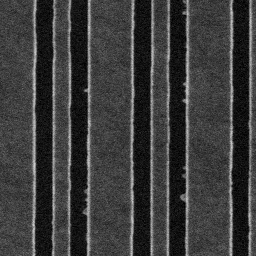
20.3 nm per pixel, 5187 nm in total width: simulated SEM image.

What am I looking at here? lines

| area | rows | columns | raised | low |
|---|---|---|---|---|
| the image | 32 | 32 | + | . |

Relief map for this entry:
++++...++..++++++..++..++++++..+
++++...++..++++++..++..++++++..+
++++...++..++++++..++..++++++..+
++++...++..++++++..++..++++++..+
++++...++..++++++..++..++++++..+
++++...++..++++++..++..++++++..+
++++...++..++++++..++..++++++..+
++++...++..++++++..++..++++++..+
++++...++..++++++..++..++++++..+
++++...++..++++++..++..++++++..+
++++...++..++++++..++..++++++..+
++++...++..++++++..++..++++++..+
++++...++..++++++..++..++++++..+
++++...++..++++++..++..++++++..+
++++...++..++++++..++..++++++..+
++++...++..++++++..++..++++++..+
++++...++..++++++..++..++++++..+
++++...++..++++++..++..++++++..+
++++...++..++++++..++..++++++..+
++++...++..++++++..++..++++++..+
++++...++..++++++..++..++++++..+
++++...++..++++++..++..++++++..+
++++...++..++++++..++..++++++..+
++++...++..++++++..++..++++++..+
++++...++..++++++..++..++++++..+
++++...++..++++++..++..++++++..+
++++...++..++++++..++..++++++..+
++++...++..++++++..++..++++++..+
++++...++..++++++..++..++++++..+
++++...++..++++++..++..++++++..+
++++...++..++++++..++..++++++..+
++++...++..++++++..++..++++++..+